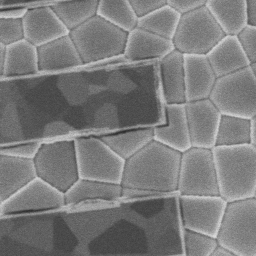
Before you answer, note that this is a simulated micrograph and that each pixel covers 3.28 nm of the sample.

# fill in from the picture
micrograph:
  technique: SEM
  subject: one or a few lines or trenches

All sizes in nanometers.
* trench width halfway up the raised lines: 232